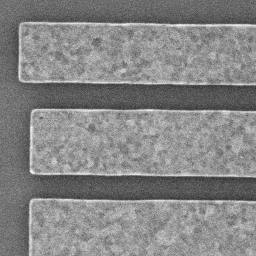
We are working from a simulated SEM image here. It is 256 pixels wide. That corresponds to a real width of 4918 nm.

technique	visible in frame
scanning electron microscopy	wiring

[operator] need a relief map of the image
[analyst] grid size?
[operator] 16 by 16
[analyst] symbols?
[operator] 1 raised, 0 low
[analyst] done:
0000000000000000
0011111110000000
0111111111111111
0111111111111111
0111111111111111
0000000000000000
0000000000000000
0011111111111111
0011111111111111
0011111111111111
0011111111111111
0000000000000000
0011000000000000
0011111111111111
0011111111111111
0011111111111111